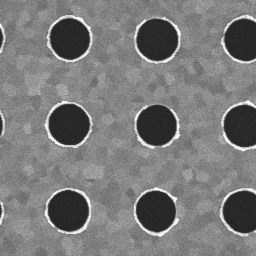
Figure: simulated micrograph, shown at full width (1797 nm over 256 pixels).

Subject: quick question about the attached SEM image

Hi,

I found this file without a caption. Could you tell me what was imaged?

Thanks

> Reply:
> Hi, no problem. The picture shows holes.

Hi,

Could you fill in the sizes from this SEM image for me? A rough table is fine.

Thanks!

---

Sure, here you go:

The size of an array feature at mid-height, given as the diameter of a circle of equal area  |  286 nanometers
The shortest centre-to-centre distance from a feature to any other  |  603 nanometres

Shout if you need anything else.